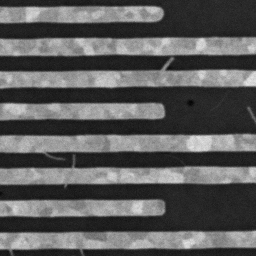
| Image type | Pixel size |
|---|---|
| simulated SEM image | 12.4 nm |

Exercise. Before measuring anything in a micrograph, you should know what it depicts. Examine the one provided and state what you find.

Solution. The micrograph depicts wiring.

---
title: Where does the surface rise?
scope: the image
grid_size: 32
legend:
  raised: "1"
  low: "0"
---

00000000000000000000000000000000
11111111111111111111000000000000
11111111111111111111000000000000
00000000000000000000000000000000
00000000000000000000000000000000
11111111111111111111111111111111
11111111111111111111111111111111
00000000000000000000000000000000
00000000000000000000000000000000
11111111111111111111111111111111
11111111111111111111111111111111
00000000000000000000000000000000
00000000000000000000000000000000
11111111111111111111000000000000
11111111111111111111000000000000
00000000000000000000000000000000
00000000000000000000000000000000
11111111111111111111111111111111
11111111111111111111111111111111
00000000000000000000000000000000
00000000000000000000000000000000
11111111111111111111111111111111
11111111111111111111111111111111
00000000000000000000000000000000
00000000000000000000000000000000
11111111111111111111100000000000
11111111111111111111000000000000
00000000000000000000000000000000
00000000000000000000000000000000
11111111111111111111111111111111
11111111111111111111111111111111
00000000000000000000000000000000